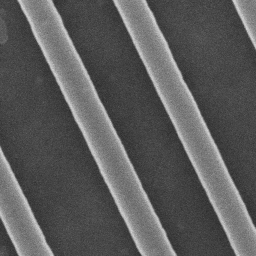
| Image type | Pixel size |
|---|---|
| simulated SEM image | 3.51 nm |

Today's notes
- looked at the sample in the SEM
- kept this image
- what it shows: lines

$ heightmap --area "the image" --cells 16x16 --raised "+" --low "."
.++....++......+
..++....++.....+
..++....++......
...++....++.....
...++....++.....
....++....++....
....++....++....
.....++....++...
.....++....++...
......++....++..
+.....++....++..
+......++....++.
++.....++....++.
++......++....++
+++.....++....++
.++......++....+